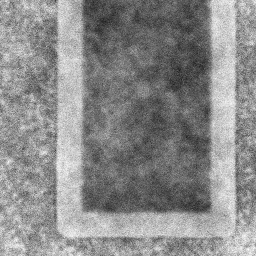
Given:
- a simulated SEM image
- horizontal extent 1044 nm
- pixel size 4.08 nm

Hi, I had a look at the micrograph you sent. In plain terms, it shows one or a few lines or trenches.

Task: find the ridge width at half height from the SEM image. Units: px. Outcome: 157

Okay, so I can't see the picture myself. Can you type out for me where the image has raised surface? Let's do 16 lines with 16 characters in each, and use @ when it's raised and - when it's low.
----@@@@@@@@@@--
----@@@@@@@@@@--
----@@@@@@@@@@--
----@@@@@@@@@@--
----@@@@@@@@@@--
----@@@@@@@@@@--
----@@@@@@@@@@--
----@@@@@@@@@@--
----@@@@@@@@@@--
----@@@@@@@@@@--
----@@@@@@@@@@--
----@@@@@@@@@@--
----@@@@@@@@@@--
----@@@@@@@@@@--
----------------
----------------